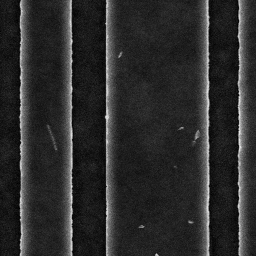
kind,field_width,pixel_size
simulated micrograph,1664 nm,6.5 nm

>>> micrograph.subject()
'lines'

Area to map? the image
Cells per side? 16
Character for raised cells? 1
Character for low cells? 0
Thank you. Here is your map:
0111000111111001
0111000111111001
0111000111111001
0111000111111001
0111000111111001
0111000111111001
0111000111111001
0111000111111001
0111000111111001
0111000111111001
0111000111111001
0111000111111001
0111000111111001
0111000111111001
0111000111111001
0111000111111001